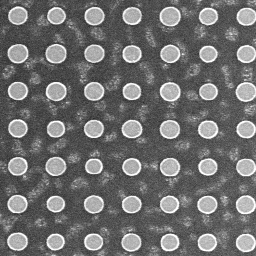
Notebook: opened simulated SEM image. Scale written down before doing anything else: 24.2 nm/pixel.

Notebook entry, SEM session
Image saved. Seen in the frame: a regular array of raised bodies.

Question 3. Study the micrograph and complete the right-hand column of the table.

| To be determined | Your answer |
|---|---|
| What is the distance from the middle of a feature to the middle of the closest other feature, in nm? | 908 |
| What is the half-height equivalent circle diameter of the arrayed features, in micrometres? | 0.43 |